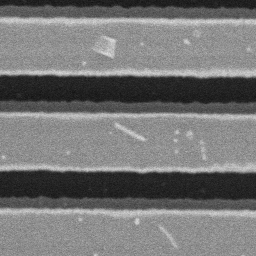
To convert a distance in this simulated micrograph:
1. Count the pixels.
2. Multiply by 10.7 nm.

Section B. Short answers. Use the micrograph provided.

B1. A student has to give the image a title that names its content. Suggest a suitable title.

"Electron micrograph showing lines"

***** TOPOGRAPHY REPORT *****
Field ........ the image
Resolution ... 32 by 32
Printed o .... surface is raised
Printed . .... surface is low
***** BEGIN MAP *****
................................
oooooooooooooooooooooooooooooooo
oooooooooooooooooooooooooooooooo
oooooooooooooooooooooooooooooooo
oooooooooooooooooooooooooooooooo
oooooooooooooooooooooooooooooooo
oooooooooooooooooooooooooooooooo
oooooooooooooooooooooooooooooooo
oooooooooooooooooooooooooooooooo
......................o.oooooooo
................................
................................
................................
oooooooooooooooooooooooooooooooo
oooooooooooooooooooooooooooooooo
oooooooooooooooooooooooooooooooo
oooooooooooooooooooooooooooooooo
oooooooooooooooooooooooooooooooo
oooooooooooooooooooooooooooooooo
oooooooooooooooooooooooooooooooo
oooooooooooooooooooooooooooooooo
.................oo....oo.oo.ooo
................................
................................
................................
oooooooooooooooooooooooooooooooo
oooooooooooooooooooooooooooooooo
oooooooooooooooooooooooooooooooo
oooooooooooooooooooooooooooooooo
oooooooooooooooooooooooooooooooo
oooooooooooooooooooooooooooooooo
oooooooooooooooooooooooooooooooo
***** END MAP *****